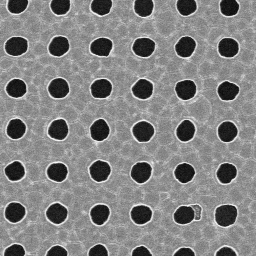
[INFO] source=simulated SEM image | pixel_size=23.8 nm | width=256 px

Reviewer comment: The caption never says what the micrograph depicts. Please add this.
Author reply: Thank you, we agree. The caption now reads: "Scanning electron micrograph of a regular array of holes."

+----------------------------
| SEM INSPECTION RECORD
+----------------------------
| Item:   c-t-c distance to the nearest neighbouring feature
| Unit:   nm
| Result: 983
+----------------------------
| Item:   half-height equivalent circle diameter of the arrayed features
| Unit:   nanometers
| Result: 496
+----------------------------